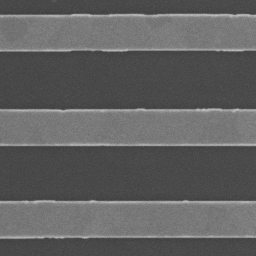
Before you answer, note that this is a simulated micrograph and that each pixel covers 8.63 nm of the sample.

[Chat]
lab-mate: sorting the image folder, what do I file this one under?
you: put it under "lines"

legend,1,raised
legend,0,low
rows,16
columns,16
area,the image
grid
0000000000000000
1111111111111111
1111111111111111
0000000000000000
0000000000000000
0000000000000000
0000000000000000
1111111111111111
1111111111111111
0000000000000000
0000000000000000
0000000000000000
0000000000000000
1111111111111111
1111111111111111
0000000000000000